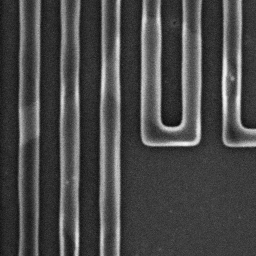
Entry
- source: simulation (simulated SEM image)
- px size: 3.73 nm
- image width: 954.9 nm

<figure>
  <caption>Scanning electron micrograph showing wiring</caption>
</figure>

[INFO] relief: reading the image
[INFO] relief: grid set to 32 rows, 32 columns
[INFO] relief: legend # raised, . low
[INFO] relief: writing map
...##...##...##...##...##...##..
...##...##...##...##...##...##..
...##...##...##...##...##...##..
...##...##...##...##...##...##..
...##...##...##...##...##...##..
...##...##...##...##...##...##..
..###...##...##...##...##...##..
..###...##...##...##...##...##..
..###...##...##...##...##...##..
..###...##...##...##...##...##..
..###...##...##...##...##...##..
..###...##...##...##...##...##..
..###...##...##...##...##...##..
..###...##...##...##...##...##..
..###...##...##...##...##...##..
..###...##...##...##..###...##..
..###...##...##...#######...####
..###...##...##...#######...####
..###...##...##.................
..###...##...##.................
..###...##...##.................
..###...##...##.................
..###...##...##.................
..###...##...##.................
..###...##...##.................
..###...##...##.................
..###...##...##.................
...##...##...##.................
...##...##...##.................
..###...##...##.................
..###........##.................
..###........##.................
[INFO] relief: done